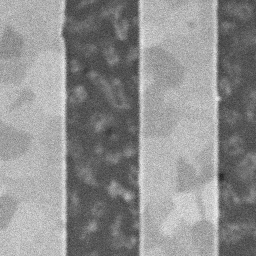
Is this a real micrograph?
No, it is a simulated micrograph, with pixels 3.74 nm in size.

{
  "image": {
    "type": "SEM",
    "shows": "one or a few lines or trenches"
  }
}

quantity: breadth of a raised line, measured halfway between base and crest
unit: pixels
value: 75.3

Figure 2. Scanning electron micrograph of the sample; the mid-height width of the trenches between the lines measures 0.285 micrometres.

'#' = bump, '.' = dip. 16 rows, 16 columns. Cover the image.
####.....####...
####.....####...
####.....####...
####.....####...
####.....####...
####.....####...
####.....#####..
####.....#####..
####.....#####..
####.....#####..
####.....#####..
####.....#####..
####.....#####..
####.....#####..
####.....#####..
####.....#####..